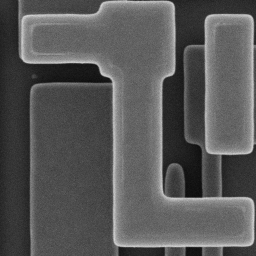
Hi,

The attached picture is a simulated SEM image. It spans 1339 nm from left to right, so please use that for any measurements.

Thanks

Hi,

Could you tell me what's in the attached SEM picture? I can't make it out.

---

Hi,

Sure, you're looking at wiring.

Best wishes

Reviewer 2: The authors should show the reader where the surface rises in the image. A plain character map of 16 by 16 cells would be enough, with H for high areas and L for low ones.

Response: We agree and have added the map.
LLLLLLHHHHHLLLLL
LHHHHHHHHHHLLHHH
LHHHHHHHHHHLLHHH
LHHHHHHHHHHLLHHH
LLLLLLHHHHHLLHHH
LLLLLLLHHHLLLHHH
LLLLLLLHHHLLLHHH
LLLLLLLHHHLLLHHH
LLLLLLLHHHLLLHHH
LLLLLLLHHHLLLHHL
LLLLLLLHHHLLLLLL
LLLLLLLHHHLLLLLL
LLLLLLLHHHHHHHHH
LLLLLLLHHHHHHHHH
LLLLLLLHHHHHHHHH
LLLLLLLLLLLLLLLL